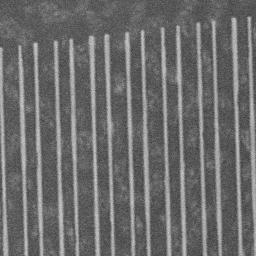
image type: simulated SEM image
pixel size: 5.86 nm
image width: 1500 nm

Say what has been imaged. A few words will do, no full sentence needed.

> parallel lines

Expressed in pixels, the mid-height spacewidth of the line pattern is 12.7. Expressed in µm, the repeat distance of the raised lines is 0.105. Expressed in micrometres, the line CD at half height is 0.0198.